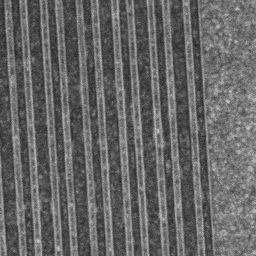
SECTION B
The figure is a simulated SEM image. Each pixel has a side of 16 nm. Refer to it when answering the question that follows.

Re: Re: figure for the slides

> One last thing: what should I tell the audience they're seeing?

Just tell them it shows parallel lines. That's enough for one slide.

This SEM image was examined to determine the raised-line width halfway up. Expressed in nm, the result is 108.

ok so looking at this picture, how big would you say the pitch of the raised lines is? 286 nm